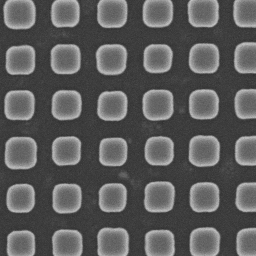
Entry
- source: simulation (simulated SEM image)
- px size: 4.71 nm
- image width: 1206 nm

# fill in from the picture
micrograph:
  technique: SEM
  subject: a regular array of raised bodies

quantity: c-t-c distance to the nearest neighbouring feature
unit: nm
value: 215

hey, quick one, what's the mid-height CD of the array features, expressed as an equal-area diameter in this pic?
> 0.147 um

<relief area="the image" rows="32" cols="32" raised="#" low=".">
.###...###..####..###...###..###
.###...###..####..####..###..###
.###...###..####..####..###..###
................................
................................
..............................##
.###..####..####..###...###..###
.###..####..####..###...###..###
.###...###..####..###...###..###
................................
................................
.###...##....##...###...###...##
.###...###..####..####..###..###
.###...###..####..####..###..###
.###...###..####..###...###...##
................................
................................
.###...###...##....##...###...##
.###...###..####..####..###..###
.###...###..####..####..###..###
.###...##....##....##...###...##
................................
................................
.###...###...###..####..###...##
.###...###..####..####..###...##
.###...###..####..####..###...##
..#....##.......................
................................
...............................#
.###...###..####..####..###...##
.###...###..####..####..###...##
.###...###..####..####..###...##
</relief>